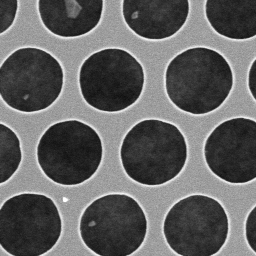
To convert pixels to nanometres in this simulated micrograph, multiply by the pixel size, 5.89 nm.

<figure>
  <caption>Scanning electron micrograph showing holes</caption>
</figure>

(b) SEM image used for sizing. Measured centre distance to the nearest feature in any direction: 493 nm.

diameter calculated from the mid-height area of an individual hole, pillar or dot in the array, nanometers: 386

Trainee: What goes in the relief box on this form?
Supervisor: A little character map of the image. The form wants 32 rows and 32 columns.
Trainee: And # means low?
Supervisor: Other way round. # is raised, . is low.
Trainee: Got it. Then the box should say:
..###........##.........##......
..###........##.........##......
..###.......####.......###......
.#####......####.......####.....
#######...#######....#######....
################################
##....######....#######....#####
#......####......#####......####
........##........###........##.
........##........###........##.
........##........###........##.
........##........###........##.
.......####......####.......####
##....######....######.....#####
################################
#######....######....#######....
..####......####.......####.....
..###........##........###......
...##........##........###......
...##........##........###......
..###.......###........###......
..###.......####......#####.....
.#####.....######....#######...#
################################
##....#######...########..######
.......####......#####.....#####
.......###........###.......###.
........##........###.......###.
........##........##.........##.
.......###........###.......###.
.......####.......###.......###.
#.....######.....#####.....#####